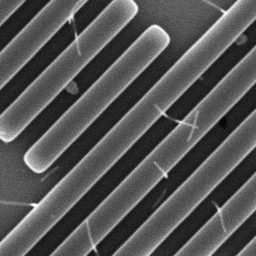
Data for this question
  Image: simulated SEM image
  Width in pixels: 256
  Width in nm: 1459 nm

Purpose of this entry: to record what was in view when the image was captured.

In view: groups of lines, slits or small figures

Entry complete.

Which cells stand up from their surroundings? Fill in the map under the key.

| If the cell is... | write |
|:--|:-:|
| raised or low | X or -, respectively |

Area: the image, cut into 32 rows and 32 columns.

XXX---XXXX----XXX------------XXX
XX---XXXX----XXXX-----------XXXX
X---XXXXX---XXXX-----------XXXXX
---XXXX----XXXX----X------XXXXX-
--XXXXX---XXXX----XXX----XXXXX--
-XXXXX---XXXX----XXXX---XXXXX---
XXXXX---XXXX----XXXX---XXXXX---X
XXXX---XXXX----XXXX---XXXXX---XX
XXX---XXXX----XXXX---XXXXX---XXX
XX---XXXX----XXXX---XXXXX---XXXX
X---XXXX----XXXX---XXXXX---XXXXX
---XXXX----XXXX----XXXX---XXXXX-
--XXXXX---XXXX----XXXX---XXXXX--
-XXXXX---XXXX----XXXX---XXXXX---
XXXXX---XXXX----XXXX---XXXXX---X
XXXX---XXXX----XXXX---XXXXX---XX
XXX---XXXX----XXXX---XXXXX---XXX
X----XXXX----XXXX---XXXXX---XXXX
----XXXX----XXXX---XXXXX---XXXXX
---XXXX----XXXX---XXXXX---XXXXX-
---XXX----XXXX---XXXXX---XXXXX--
---------XXXX---XXXXX---XXXXX---
--------XXXX----XXXX---XXXXX---X
-------XXXX----XXXX---XXXXX---XX
------XXXX----XXXX---XXXXX---XXX
-----XXXX----XXXX---XXXXX---XXXX
----XXXX----XXXX---XXXXX---XXXXX
---XXXX----XXXX---XXXXX---XXXXX-
--XXXX----XXXX---XXXXX---XXXXX--
-XXXX----XXXX---XXXXX---XXXXX---
XXXX----XXXX---XXXXX---XXXXX---X
XXX----XXXX---XXXXX---XXXXX---XX